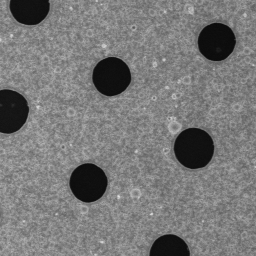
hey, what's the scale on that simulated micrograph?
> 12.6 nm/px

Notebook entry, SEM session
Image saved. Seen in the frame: holes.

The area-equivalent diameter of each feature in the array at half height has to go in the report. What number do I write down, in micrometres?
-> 0.487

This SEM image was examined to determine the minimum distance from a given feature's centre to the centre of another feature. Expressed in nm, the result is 1370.